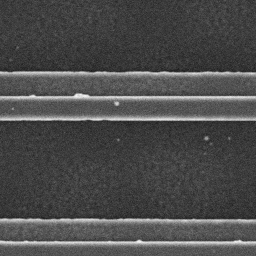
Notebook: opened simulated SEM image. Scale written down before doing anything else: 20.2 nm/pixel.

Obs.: lines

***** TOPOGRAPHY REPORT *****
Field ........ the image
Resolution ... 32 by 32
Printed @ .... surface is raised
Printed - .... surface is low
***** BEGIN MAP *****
--------------------------------
--------------------------------
--------------------------------
--------------------------------
--------------------------------
--------------------------------
--------------------------------
--------------------------------
--------------------------------
@@@@@@@@@@@@@@@@@@@@@@@@@@@@@@@@
@@@@@@@@@@@@@@@@@@@@@@@@@@@@@@@@
@@@@@@@@@@@@@@@@@@@@@@@@@@@@@@@@
@@@@@@@@@@@@@@@@@@@@@@@@@@@@@@@@
@@@@@@@@@@@@@@@@@@@@@@@@@@@@@@@@
@@@@@@@@@@@@@@@@@@@@@@@@@@@@@@@@
--------------------------------
--------------------------------
--------------------------------
--------------------------------
--------------------------------
--------------------------------
--------------------------------
--------------------------------
--------------------------------
--------------------------------
--------------------------------
--------------------------------
-@@--------@--------------------
@@@@@@@@@@@@@@@@@@@@@@@@@@@@@@@@
@@@@@@@@@@@@@@@@@@@@@@@@@@@@@@@@
@@@@@@@@@@@@@@@@@@@@@@@@@@@@@@@@
@@@@@@@@@@@@@@@@@@@@@@@@@@@@@@@@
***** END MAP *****